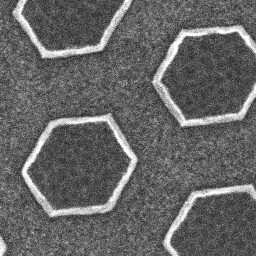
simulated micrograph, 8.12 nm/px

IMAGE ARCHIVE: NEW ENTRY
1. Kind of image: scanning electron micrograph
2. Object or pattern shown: raised bodies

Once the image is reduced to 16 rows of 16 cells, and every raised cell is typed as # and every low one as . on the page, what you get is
.#######........
.######.........
..#####....#####
...........#####
..........######
..........######
...........#####
.....##....##...
...#####........
..######........
..######........
..######........
...####.....####
...........#####
...........#####
...........#####